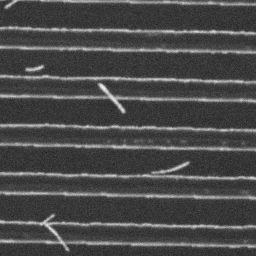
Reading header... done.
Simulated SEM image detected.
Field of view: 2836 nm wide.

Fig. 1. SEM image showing lines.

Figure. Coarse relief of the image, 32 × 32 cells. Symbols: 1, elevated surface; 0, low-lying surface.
00000000000000000000000000001111
00000000000000000000000000000000
00000000000000000000000000000000
01100000000000000000000000000000
11111111111111111111111111111111
11111111111111111111111111111111
00000000000000000000000000000011
00000000000000000000000000000000
00000000000000000000000000000000
00000000000000000000000000000000
11111111111111111111111111111111
11111111111111111111111111111111
00000000000000100000000000011111
00000000000000000000000000000000
00000000000000000000000000000000
00000000000000000000000000000000
11111111111111111111111111111111
11111111111111111111111111111111
00000000000000000000000111111111
00000000000000000000000000000000
00000000000000000000000000000000
00000000000000000000000000000000
11111111111111111111111111111111
11111111111111111111111111111111
00000000000000000000011111111111
00000000000000000000000000000000
00000000000000000000000000000000
00000000000000000000000000000000
11111111111111111111111111111111
11111111111111111111111111111111
00000000000000000000111111111111
00000000000000000000000000000000